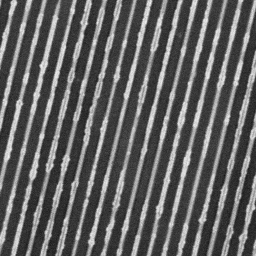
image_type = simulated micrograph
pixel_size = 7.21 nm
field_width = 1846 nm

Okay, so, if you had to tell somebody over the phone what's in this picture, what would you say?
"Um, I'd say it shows parallel lines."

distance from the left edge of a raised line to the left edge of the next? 0.106 um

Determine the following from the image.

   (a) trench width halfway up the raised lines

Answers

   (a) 72.8 nanometres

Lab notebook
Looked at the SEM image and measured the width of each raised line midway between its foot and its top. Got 33.3 nanometers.